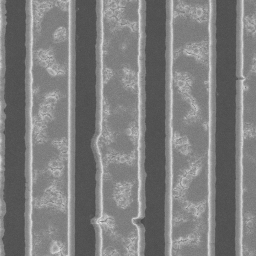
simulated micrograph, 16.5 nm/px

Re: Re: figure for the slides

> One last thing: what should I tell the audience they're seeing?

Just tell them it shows one or a few lines or trenches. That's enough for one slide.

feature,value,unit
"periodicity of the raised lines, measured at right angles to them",1160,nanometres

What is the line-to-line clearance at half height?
458 nm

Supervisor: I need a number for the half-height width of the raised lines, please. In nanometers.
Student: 708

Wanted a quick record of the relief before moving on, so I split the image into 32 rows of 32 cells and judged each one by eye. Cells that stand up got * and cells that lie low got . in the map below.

....*****...******...******...**
....*****...******...******...**
....*****...******...*****....**
....*****....*****...*****....**
....*****....*****...*****....**
....*****...******...******...**
....*****...******...******...**
....*****...******...*****....**
....*****...******...******...**
....*****....*****...******...**
....*****...******...******...**
....*****...******...*****....**
....*****...******...*****....**
....*****...******...******...**
....*****...******...******...**
....*****...******...******...**
....*****...******...*****....**
....*****...******...******...**
....*****...******...*****....**
....*****...******...*****....**
....*****...******...*****....**
....*****....*****...*****....**
....*****...******...*****....**
....*****...******...*****....**
....*****...******...*****....**
....*****...******...*****....**
....*****...******...*****....**
....*****...*****....*****....**
....*****...******...*****....**
....*****...******...*****....**
....*****...******...*****....**
....*****...******...*****....**